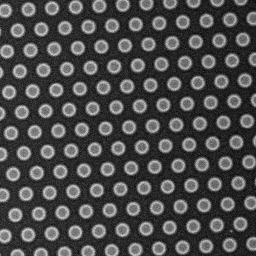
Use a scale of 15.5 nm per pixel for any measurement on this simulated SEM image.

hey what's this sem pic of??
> an array of small figures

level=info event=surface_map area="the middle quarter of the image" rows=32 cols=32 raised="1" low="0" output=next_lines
11000111000111000111000111000111
11100111000111000111000111000010
11000011000000000000000000000000
00000000000000000000010000111000
00001000011000111000111000111000
00111100111100111100111000111000
00111100111100111000111000011000
00011000011000000000000000000000
00000000000000000000000011000011
00000011000011000111000111100111
11100111100111100111100111100111
11100111100111100111100111000011
11100011100011000000000000000000
00000000000000000000000000011000
00000000001000011100011100111100
00011100011100111100111100111100
00011100011100011100111100011000
00011100011100001000000000000000
00000000000000000000000000000001
00000000000011100011100011100011
11100011100011100011100011100011
11110011100011100011100011100011
11110011100011100001000000000000
01000000000000000000000000000000
00000000001000001100011100011100
00011110011110011110011110011100
10011110011110011110011100011100
10011110011100001100001000000000
00000000000000000000000000000000
00000000000000000001100011100011
01110001110011110011110011110011
01110011110011110011110011110011